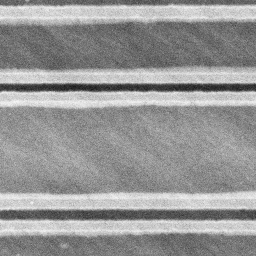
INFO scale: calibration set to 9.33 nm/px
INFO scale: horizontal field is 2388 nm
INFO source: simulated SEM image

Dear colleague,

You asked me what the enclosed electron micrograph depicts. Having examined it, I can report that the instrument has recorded lines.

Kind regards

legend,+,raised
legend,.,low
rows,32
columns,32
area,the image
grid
++++++++++++++++++++++++++++++++
++++++++++++++++++++++++++++++++
................................
................................
................................
................................
................................
................................
................................
++++++++++++++++++++++++++++++++
++++++++++++++++++++++++++++++++
++++++++++++++++++++++++++++++++
++++++++++++++++++++++++++++++++
................................
................................
................................
................................
................................
................................
................................
................................
................................
................................
................................
................................
++++++++++++++++++++++++++++++++
++++++++++++++++++++++++++++++++
++++++++++++++++++++++++++++++++
++++++++++++++++++++++++++++++++
................................
................................
................................